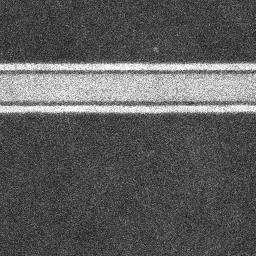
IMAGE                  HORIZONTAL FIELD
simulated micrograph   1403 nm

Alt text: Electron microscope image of one or a few lines or trenches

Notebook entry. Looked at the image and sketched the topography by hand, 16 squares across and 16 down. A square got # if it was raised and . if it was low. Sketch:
################
################
################
################
................
................
................
################
################
################
################
################
################
################
################
################